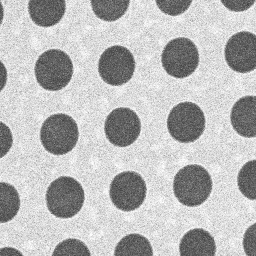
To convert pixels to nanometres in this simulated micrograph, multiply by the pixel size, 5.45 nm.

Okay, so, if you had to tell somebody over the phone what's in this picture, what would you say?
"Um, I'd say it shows a regular array of holes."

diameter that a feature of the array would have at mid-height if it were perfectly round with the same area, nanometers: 213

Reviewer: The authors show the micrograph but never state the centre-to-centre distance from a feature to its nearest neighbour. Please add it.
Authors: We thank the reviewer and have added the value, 0.345 microns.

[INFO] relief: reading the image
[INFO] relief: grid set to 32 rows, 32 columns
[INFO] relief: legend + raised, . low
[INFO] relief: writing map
++++....+++.....++++....++++....
++++....++++....++++...+++++++++
++++....+++++.++++++++++++++++++
++++++++++++++++++++++++++++++++
+++++++++++++++++++++++++++++...
+++++++++++++++++++++...++++....
++++++..+++++...++++.....+++....
+++++....+++.....+++.....+++....
.+++.....+++.....+++....+++++...
.+++.....++++...+++++..+++++++++
.++++...++++++.+++++++++++++++++
++++++++++++++++++++++++++++++++
++++++++++++++++++++++++++++++..
++++++++++++++++++++++...++++...
++++++...+++++...++++.....+++...
.++++....++++.....+++.....+++...
.++++.....+++....++++....+++++..
..+++.....++++...+++++..++++++++
.+++++...+++++++++++++++++++++++
++++++++++++++++++++++++++++++++
+++++++++++++++++++++++++++++++.
++++++++++++++++.+++++....++++..
+++++++..+++++....++++....++++..
..++++....++++....++++....++++..
..++++.....+++....++++....+++++.
..++++....++++....+++++..+++++++
..++++....++++++++++++++++++++++
.+++++++++++++++++++++++++++++++
+++++++++++++++++++++++++++++++.
++++++++++++++++..+++++...+++++.
+++++++....++++....+++.....+++..
...++++....+++.....+++.....++++.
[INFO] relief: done